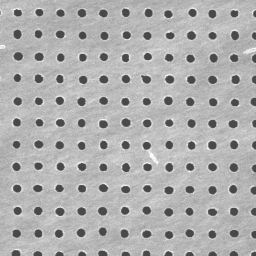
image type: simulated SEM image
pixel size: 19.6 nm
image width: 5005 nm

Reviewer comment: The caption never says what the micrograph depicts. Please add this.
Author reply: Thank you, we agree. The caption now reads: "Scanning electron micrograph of a regular array of holes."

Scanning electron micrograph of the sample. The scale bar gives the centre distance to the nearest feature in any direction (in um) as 0.412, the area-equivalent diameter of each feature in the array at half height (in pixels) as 8.37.